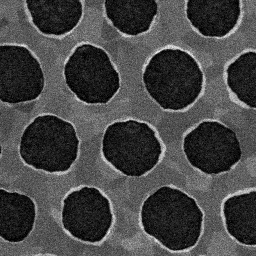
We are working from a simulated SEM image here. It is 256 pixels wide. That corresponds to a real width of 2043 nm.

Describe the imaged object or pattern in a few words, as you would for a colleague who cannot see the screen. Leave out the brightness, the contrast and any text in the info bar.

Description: holes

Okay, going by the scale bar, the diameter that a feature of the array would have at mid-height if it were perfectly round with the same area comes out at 462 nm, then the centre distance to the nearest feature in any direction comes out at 79.7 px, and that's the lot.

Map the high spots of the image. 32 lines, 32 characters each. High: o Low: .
ooo.......ooo.......ooo.......oo
oooo......ooo.......ooo.......oo
oooo......oooo.....ooooo......oo
oooo.....ooooo.....ooooo.....ooo
oooooo.oooooooooooooooooo...oooo
oooooooooo.ooooooooooooooooooooo
....ooooo....ooooooo...ooooooo..
.....ooo......ooooo.....ooooo...
.....ooo......oooo.......ooo....
.....ooo.......ooo.......ooo....
.....ooo.......ooo.......ooo....
.....oooo.....ooooo......oooo...
....oooooo....ooooo.....oooooo..
oooooooooooooooooooo...oooooooo.
ooooo..ooooooooooooooooooooooooo
oooo.....ooooo....ooooooo...oooo
ooo......oooo......oooo......ooo
ooo.......ooo.......ooo.......oo
oo........ooo.......ooo.......oo
ooo.......ooo.......ooo.......oo
ooo......ooooo......oooo......oo
oooooo..ooooooo....oooooo...oooo
oooooooooooooooooooooooooooooooo
oooooooooo..oooooooo..oooooooooo
...ooooo.....oooooo.....ooooo...
....oooo......oooo.......ooo....
....oooo......oooo.......ooo....
....oooo......oooo.......ooo....
....oooo......oooo.......ooo....
...oooooo....oooooo......oooo...
oooooooooooooooooooo....oooooo..
oooooooooooooooooooooooooooooooo